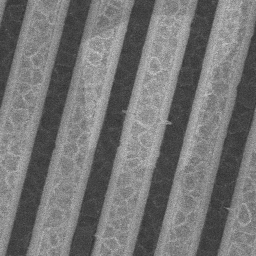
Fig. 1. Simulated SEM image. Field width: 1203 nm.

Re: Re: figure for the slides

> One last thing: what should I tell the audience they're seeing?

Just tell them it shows one or a few lines or trenches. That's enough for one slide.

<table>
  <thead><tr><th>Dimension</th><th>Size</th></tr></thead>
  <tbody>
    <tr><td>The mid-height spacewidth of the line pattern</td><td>133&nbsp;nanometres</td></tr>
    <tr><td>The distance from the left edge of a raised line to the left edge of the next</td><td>290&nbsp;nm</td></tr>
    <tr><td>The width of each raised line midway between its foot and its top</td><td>32.9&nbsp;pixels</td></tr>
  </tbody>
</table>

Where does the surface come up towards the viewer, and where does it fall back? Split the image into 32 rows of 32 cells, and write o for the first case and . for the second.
....oooo....oooo....oooo....oooo
....oooo....oooo....oooo...ooooo
...ooooo...ooooo...ooooo...ooooo
...oooo....oooo....oooo....oooo.
...oooo....oooo....oooo....oooo.
...oooo....oooo....oooo...ooooo.
..ooooo...ooooo...ooooo...oooo..
..oooo....oooo....oooo....oooo..
..oooo....oooo....oooo....oooo..
..oooo...ooooo...ooooo...ooooo..
.ooooo...ooooo...ooooo...oooo...
.oooo....oooo....oooo....oooo...
.oooo....oooo....oooo....oooo...
.oooo...ooooo...ooooo...ooooo...
ooooo...ooooo...ooooo...oooo....
oooo....oooo....oooo....oooo....
oooo....oooo....oooo....oooo....
oooo...ooooo...ooooo...ooooo...o
oooo...ooooo...ooooo...oooo....o
ooo....oooo....oooo....oooo....o
ooo....oooo....oooo....oooo....o
ooo....oooo...ooooo...ooooo...oo
ooo...ooooo...ooooo...oooo....oo
oo....oooo....oooo....oooo....oo
oo....oooo....oooo....oooo....oo
oo....oooo...ooooo...ooooo...ooo
oo...oooo....oooo....oooo....ooo
o....oooo....oooo....oooo....ooo
o....oooo....oooo....oooo....ooo
o...ooooo...ooooo...ooooo...oooo
o...oooo....oooo....oooo....oooo
....oooo....oooo....oooo....oooo